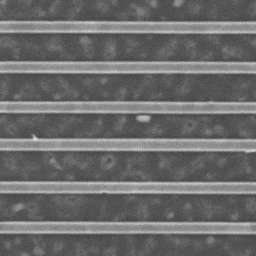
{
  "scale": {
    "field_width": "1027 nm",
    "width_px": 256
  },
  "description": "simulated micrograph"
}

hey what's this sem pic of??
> parallel lines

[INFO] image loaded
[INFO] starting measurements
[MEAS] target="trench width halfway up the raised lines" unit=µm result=0.122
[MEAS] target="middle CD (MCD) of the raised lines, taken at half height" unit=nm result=42.1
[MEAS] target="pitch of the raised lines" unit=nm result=161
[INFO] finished